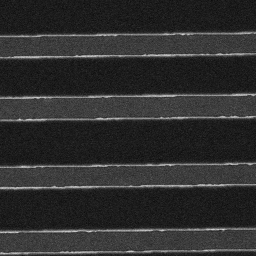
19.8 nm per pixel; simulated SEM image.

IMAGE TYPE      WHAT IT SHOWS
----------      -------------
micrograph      lines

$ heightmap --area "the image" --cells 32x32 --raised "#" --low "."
################################
################################
################################
################################
######..........................
................................
................................
################################
################################
################################
################################
################################
................................
................................
................................
################################
################################
################################
################################
################################
##############################.#
................................
................................
################################
################################
################################
################################
################################
################################
................................
................................
................#.##############